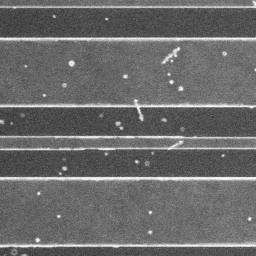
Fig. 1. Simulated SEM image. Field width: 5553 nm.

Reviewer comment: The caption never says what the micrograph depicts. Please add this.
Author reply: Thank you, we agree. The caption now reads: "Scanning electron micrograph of lines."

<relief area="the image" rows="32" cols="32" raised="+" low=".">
++++++++++++++++++++++++++++++++
................................
................................
................................
................................
++++++++++++++++++++++++++++++++
++++++++++++++++++++++++++++++++
++++++++++++++++++++++++++++++++
++++++++++++++++++++++++++++++++
++++++++++++++++++++++++++++++++
++++++++++++++++++++++++++++++++
++++++++++++++++++++++++++++++++
++++++++++++++++++++++++++++++++
................................
................................
................................
................................
++++++++++++++++++++++++++++++++
++++++++++++++++++++++++++++++++
................................
................................
................................
++++++++++++++++++++++++++++++++
++++++++++++++++++++++++++++++++
++++++++++++++++++++++++++++++++
++++++++++++++++++++++++++++++++
++++++++++++++++++++++++++++++++
++++++++++++++++++++++++++++++++
++++++++++++++++++++++++++++++++
++++++++++++++++++++++++++++++++
++++++++++++++++++++++++++++++++
................................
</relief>